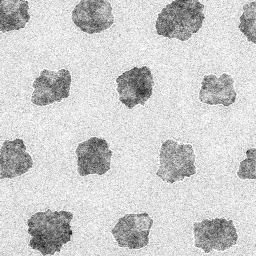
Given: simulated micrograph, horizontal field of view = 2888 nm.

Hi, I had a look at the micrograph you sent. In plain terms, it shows raised bodies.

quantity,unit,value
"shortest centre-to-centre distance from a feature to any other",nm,923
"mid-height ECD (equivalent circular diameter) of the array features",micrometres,0.45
